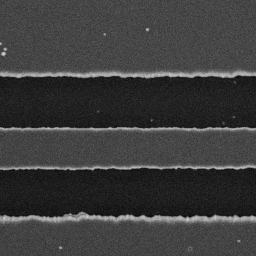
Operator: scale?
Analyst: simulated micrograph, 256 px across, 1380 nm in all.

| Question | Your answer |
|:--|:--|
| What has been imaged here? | lines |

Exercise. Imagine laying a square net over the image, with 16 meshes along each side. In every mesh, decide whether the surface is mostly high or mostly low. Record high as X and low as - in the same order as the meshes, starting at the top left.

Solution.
XXXXXXXXXXXXXXXX
XXXXXXXXXXXXXXXX
XXXXXXXXXXXXXXXX
XXXXXXXXXXXXXXXX
XXXXXXXXXXXXXXXX
----------------
----------------
----------------
XXXXXXXXXXXXXXXX
XXXXXXXXXXXXXXXX
XXXXXXXXX-X-XXXX
----------------
----------------
-----XXXX-------
XXXXXXXXXXXXXXXX
XXXXXXXXXXXXXXXX